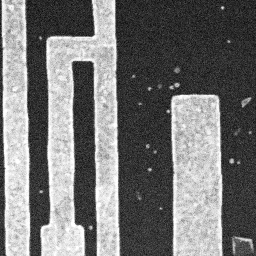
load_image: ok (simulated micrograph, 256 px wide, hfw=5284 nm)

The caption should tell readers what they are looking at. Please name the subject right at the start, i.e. wiring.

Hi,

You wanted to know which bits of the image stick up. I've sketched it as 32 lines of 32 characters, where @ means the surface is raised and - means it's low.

-@@---------@@------------------
-@@---------@@------------------
-@@---------@@------------------
-@@---------@@------------------
-@@---------@@------------------
-@@---@@@@@@@@------------------
-@@---@@@@@@@@------------------
-@@---@@@--@@@------------------
-@@---@@@---@@------------------
-@@---@@@---@@------------------
-@@---@@@---@@------------------
-@@---@@@---@@------------------
-@@---@@@---@@--------@@@@@-----
-@@---@@@---@@--------@@@@@-----
-@@---@@@---@@--------@@@@@-----
-@@---@@@---@@--------@@@@@-----
-@@---@@@---@@--------@@@@@-----
-@@---@@@---@@--------@@@@@-----
-@@---@@@---@@--------@@@@@-----
-@@---@@@---@@--------@@@@@-----
-@@---@@@---@@--------@@@@@-----
-@@---@@@---@@--------@@@@@-----
-@@---@@@---@@--------@@@@@-----
-@@---@@@---@@--------@@@@@-----
-@@---@@@---@@--------@@@@@-----
-@@---@@@---@@@-------@@@@@-----
-@@---@@@---@@@-------@@@@@-----
-@@---@@@---@@@-------@@@@@-----
-@@---@@@@--@@@-------@@@@@-----
-@@--@@@@@--@@@-------@@@@@-----
-@@--@@@@@--@@@-------@@@@@--@@-
-@@--@@@@@--@@@-------@@@@@@----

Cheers